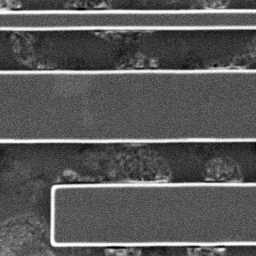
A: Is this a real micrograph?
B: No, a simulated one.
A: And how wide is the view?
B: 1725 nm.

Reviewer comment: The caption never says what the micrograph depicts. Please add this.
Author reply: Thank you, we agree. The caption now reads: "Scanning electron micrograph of groups of lines, slits or small figures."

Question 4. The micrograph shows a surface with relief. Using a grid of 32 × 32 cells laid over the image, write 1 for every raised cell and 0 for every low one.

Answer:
00000000000000000000000000000000
00000011100111111111111111111111
11111111111111111111111111111111
11111111111111111111111111110000
00000000000000000000000000000000
00000000000000000000000000000000
00000000000000000000000000000000
00000000000000000000000000000000
00000000000000000000000000000000
11111111111111111111111111111111
11111111111111111111111111111111
11111111111111111111111111111111
11111111111111111111111111111111
11111111111111111111111111111111
11111111111111111111111111111111
11111111111111111111111111111111
11111111111111111111111111111111
11111111111111111111111111111111
00000000000000000000000000000000
00000000000000000000000000000000
00000000000000000000000000000000
00000000000000000000000000000000
00000000000000000000000000000000
00000001111111111111111111111111
00000001111111111111111111111111
00000001111111111111111111111111
00000001111111111111111111111111
00000001111111111111111111111111
00000001111111111111111111111111
00000001111111111111111111111111
00000001111111111111111111111101
00000000000000000000000000000000